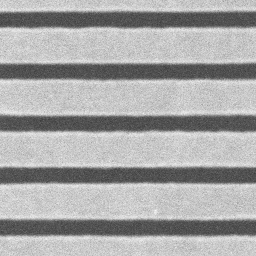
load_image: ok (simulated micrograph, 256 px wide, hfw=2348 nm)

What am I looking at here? lines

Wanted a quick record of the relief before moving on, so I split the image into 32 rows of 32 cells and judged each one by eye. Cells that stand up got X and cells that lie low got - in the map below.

XXXXXXXXXXXXXXXXXXXXXXXXXXXXXXXX
--------------------------------
--------------------------------
XX---XXX---XXX---XX-XXXXXXXXXX-X
XXXXXXXXXXXXXXXXXXXXXXXXXXXXXXXX
XXXXXXXXXXXXXXXXXXXXXXXXXXXXXXXX
XXXXXXXXXXXXXXXXXXXXXXXXXXXXXXXX
XXXXXXXXXXXXXXXXXXXXXXXXXXXXXXXX
--------------------------------
--------------------------------
XXXXXXXXXXXXXXXXXXXXXXXXXXXXXXXX
XXXXXXXXXXXXXXXXXXXXXXXXXXXXXXXX
XXXXXXXXXXXXXXXXXXXXXXXXXXXXXXXX
XXXXXXXXXXXXXXXXXXXXXXXXXXXXXXXX
--------------------------------
--------------------------------
XXXXXXXXXXXXXXXXXXXXXXXXXXXXXXXX
XXXXXXXXXXXXXXXXXXXXXXXXXXXXXXXX
XXXXXXXXXXXXXXXXXXXXXXXXXXXXXXXX
XXXXXXXXXXXXXXXXXXXXXXXXXXXXXXXX
XXXXXXXXXXXXXXXXXXXXXXXXXXXXXXXX
--------------------------------
--------------------------------
XXXXXXXXXXXXXXXXXXXXXXXXXXXXXXXX
XXXXXXXXXXXXXXXXXXXXXXXXXXXXXXXX
XXXXXXXXXXXXXXXXXXXXXXXXXXXXXXXX
XXXXXXXXXXXXXXXXXXXXXXXXXXXXXXXX
--------------------------------
--------------------------------
XXXXXXXXXXXXXXXX--XXXXXXXX-XXXXX
XXXXXXXXXXXXXXXXXXXXXXXXXXXXXXXX
XXXXXXXXXXXXXXXXXXXXXXXXXXXXXXXX